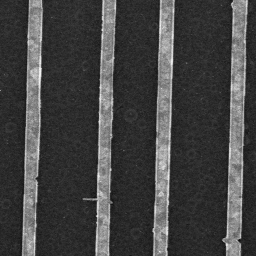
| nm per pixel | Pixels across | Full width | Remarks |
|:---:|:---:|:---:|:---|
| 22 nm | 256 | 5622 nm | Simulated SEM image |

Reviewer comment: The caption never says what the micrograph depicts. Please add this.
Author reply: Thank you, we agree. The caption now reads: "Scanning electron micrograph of one or a few lines or trenches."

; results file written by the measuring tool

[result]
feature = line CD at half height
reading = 285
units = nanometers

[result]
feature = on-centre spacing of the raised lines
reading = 1.5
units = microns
